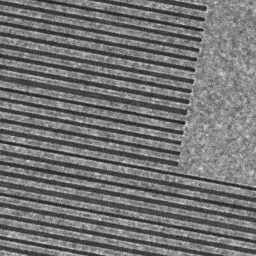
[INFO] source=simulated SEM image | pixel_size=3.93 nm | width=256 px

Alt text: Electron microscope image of parallel lines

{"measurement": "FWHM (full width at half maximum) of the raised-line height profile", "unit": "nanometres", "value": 20.7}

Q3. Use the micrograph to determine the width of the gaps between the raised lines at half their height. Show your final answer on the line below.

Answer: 17.3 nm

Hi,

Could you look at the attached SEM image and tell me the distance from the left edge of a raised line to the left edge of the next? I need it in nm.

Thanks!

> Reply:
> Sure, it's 41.